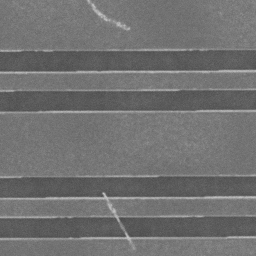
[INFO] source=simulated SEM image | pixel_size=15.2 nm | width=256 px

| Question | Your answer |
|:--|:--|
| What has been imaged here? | lines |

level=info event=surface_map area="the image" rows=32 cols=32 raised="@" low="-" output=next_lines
@@@@@@@@@@@@@@@@@@@@@@@@@@@@@@@@
@@@@@@@@@@@@@@@@@@@@@@@@@@@@@@@@
@@@@@@@@@@@@@@@@@@@@@@@@@@@@@@@@
@@@@@@@@@@@@@@@@@@@@@@@@@@@@@@@@
@@@@@@@@@@@@@@@@@@@@@@@@@@@@@@@@
@@@@@@@@@@@@@@@@@@@@@@@@@@@@@@@@
--------------------------------
--------------------------------
--------------------------------
@@@@@@@@@@@@@@@@@@@@@@@@@@@@@@@@
@@@@@@@@@@@@@@@@@@@@@@@@@@@@@@@@
--------------------------------
--------------------------------
--------------------------------
@@@@@@@@@@@@@@@@@@@@@@@@@@@@@@@@
@@@@@@@@@@@@@@@@@@@@@@@@@@@@@@@@
@@@@@@@@@@@@@@@@@@@@@@@@@@@@@@@@
@@@@@@@@@@@@@@@@@@@@@@@@@@@@@@@@
@@@@@@@@@@@@@@@@@@@@@@@@@@@@@@@@
@@@@@@@@@@@@@@@@@@@@@@@@@@@@@@@@
@@@@@@@@@@@@@@@@@@@@@@@@@@@@@@@@
@@@@@@@@@@@@@@@@@@@@@@@@@@@@@@@@
--------------------------------
--------------------------------
--------------------------------
@@@@@@@@@@@@@@@@@@@@@@@@@@@@@@@@
@@@@@@@@@@@@@@@@@@@@@@@@@@@@@@@@
--------------------------------
--------------------------------
--------------------------------
@@@@@@@@@@@@@@@@@@@@@@@@@@@@@@@@
@@@@@@@@@@@@@@@@@@@@@@@@@@@@@@@@